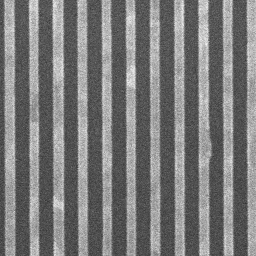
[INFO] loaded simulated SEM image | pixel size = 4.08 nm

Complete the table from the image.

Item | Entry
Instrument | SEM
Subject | parallel lines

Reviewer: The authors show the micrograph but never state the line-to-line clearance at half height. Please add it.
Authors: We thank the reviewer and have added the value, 66.3 nanometres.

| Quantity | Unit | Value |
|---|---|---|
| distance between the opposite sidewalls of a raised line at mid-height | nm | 33.2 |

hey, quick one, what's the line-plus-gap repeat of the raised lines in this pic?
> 0.099 microns